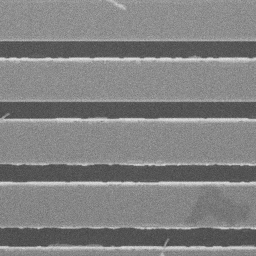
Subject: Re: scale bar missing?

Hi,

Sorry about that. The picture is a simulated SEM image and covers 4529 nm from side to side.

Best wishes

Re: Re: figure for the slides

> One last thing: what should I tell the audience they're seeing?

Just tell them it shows lines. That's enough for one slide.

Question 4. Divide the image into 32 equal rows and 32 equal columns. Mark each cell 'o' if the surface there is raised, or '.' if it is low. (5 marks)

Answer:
oooooooooooooooooooooooooooooooo
oooooooooooooooooooooooooooooooo
oooooooooooooooooooooooooooooooo
oooooooooooooooooooooooooooooooo
oooooooooooooooooooooooooooooooo
................................
................................
oooooooooooooooooooooooooooooooo
oooooooooooooooooooooooooooooooo
oooooooooooooooooooooooooooooooo
oooooooooooooooooooooooooooooooo
oooooooooooooooooooooooooooooooo
oooooooooooooooooooooooooooooooo
................................
................................
oooooooooooooooooooooooooooooooo
oooooooooooooooooooooooooooooooo
oooooooooooooooooooooooooooooooo
oooooooooooooooooooooooooooooooo
oooooooooooooooooooooooooooooooo
.....o..........ooooo.oo.....ooo
................................
................................
oooooooooooooooooooooooooooooooo
oooooooooooooooooooooooooooooooo
oooooooooooooooooooooooooooooooo
oooooooooooooooooooooooooooooooo
oooooooooooooooooooooooooooooooo
................................
................................
................................
oooooooooooooooooooooooooooooooo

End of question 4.